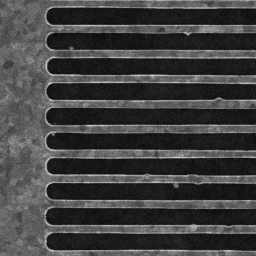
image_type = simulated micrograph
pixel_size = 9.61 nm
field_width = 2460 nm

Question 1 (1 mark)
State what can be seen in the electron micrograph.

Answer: parallel lines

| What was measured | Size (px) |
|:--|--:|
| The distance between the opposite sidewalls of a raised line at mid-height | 7.38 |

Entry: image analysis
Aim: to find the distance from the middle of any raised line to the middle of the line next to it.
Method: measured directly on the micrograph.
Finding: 240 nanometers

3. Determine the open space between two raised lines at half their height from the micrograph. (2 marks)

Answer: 0.167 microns